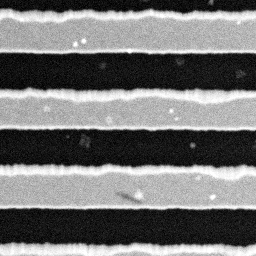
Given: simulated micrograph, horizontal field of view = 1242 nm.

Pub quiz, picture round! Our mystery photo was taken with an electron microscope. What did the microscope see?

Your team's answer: lines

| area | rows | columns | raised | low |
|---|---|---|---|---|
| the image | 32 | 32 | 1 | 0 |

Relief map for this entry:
00000000000000000000000000000000
11000000001100000011000000000000
11111111111111111111111111111111
11111111111111111111111111111111
11111111111111111111111111111111
11111111111111111111111111111111
11111111111111111111111111111111
00000000000000000000000000000000
00000000000000000000000000000000
00000000000000000000000000000000
00000000000000000000000000000000
11111111100000111111110010000100
11111111111111111111111111111111
11111111111111111111111111111111
11111111111111111111111111111111
11111111111111111111111111111111
00000000000000000000000000000000
00000000000000000000000000000000
00000000000000000000000000000000
00000000000000000000000000000000
00000000000000000000000000000000
11111111111111111111111111111111
11111111111111111111111111111111
11111111111111111111111111111111
11111111111111111111111111111111
11111111111111111111111111111111
00000000000000000000000000000000
00000000000000000000000000000000
00000000000000000000000000000000
00000000000000000000000000000000
00000000000000000000000000000000
11111111111111111111111111111111